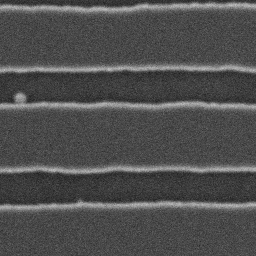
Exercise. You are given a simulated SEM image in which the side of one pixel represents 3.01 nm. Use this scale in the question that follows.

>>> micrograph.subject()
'lines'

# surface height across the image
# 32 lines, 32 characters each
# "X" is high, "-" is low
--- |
------------------------X-X--XX-
XXXXXXXXXXXXXXXXXXXXXXXXXXXXXXXX
XXXXXXXXXXXXXXXXXXXXXXXXXXXXXXXX
XXXXXXXXXXXXXXXXXXXXXXXXXXXXXXXX
XXXXXXXXXXXXXXXXXXXXXXXXXXXXXXXX
XXXXXXXXXXXXXXXXXXXXXXXXXXXXXXXX
XXXXXXXXXXXXXXXXXXXXXXXXXXXXXXXX
XXXXXXXXXXXXXXXXXXXXXXXXXXXXXXXX
XXXXXXXXXXXXXXXXXXXXXXXXXXXXXXXX
--------------------------------
--------------------------------
--------------------------------
--------------------------------
XXXXXXXXXXXXXXXXXXXXXXXXXXXXXXXX
XXXXXXXXXXXXXXXXXXXXXXXXXXXXXXXX
XXXXXXXXXXXXXXXXXXXXXXXXXXXXXXXX
XXXXXXXXXXXXXXXXXXXXXXXXXXXXXXXX
XXXXXXXXXXXXXXXXXXXXXXXXXXXXXXXX
XXXXXXXXXXXXXXXXXXXXXXXXXXXXXXXX
XXXXXXXXXXXXXXXXXXXXXXXXXXXXXXXX
XXXXXXXXXXXXXXXXXXXXXXXXXXXXXXXX
--------XXXX--------------------
--------------------------------
--------------------------------
--------------------------------
----------XX----XXXXXXXXXX-----X
XXXXXXXXXXXXXXXXXXXXXXXXXXXXXXXX
XXXXXXXXXXXXXXXXXXXXXXXXXXXXXXXX
XXXXXXXXXXXXXXXXXXXXXXXXXXXXXXXX
XXXXXXXXXXXXXXXXXXXXXXXXXXXXXXXX
XXXXXXXXXXXXXXXXXXXXXXXXXXXXXXXX
XXXXXXXXXXXXXXXXXXXXXXXXXXXXXXXX